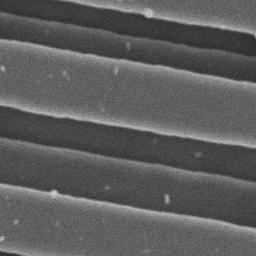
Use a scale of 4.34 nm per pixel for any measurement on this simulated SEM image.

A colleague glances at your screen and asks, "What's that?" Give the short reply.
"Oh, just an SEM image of lines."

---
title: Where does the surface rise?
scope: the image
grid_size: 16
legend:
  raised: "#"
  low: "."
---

.......#########
............####
................
######..........
############....
################
################
.....###########
...........#####
................
................
................
######..........
############....
################
################